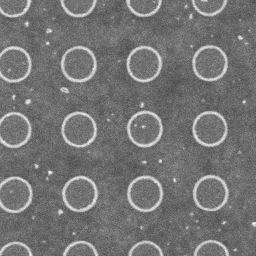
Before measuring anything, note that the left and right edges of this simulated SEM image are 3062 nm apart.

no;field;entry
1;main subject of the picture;a regular array of raised bodies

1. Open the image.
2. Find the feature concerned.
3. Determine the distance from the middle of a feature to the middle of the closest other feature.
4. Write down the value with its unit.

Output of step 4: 775 nm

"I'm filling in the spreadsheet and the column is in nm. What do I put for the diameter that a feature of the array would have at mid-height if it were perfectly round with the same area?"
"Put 406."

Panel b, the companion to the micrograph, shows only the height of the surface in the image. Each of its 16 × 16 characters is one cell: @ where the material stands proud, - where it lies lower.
@@--@@--@@--@@--
----------------
----------------
@@--@@--@@--@@--
@@--@@--@@--@@--
----------------
----------------
@@--@@--@@--@@--
@@--@@--@@--@@--
----------------
----------------
@@--@@--@@--@@--
@@--@@--@@--@@--
----------------
----------------
@@--@@--@@--@@--